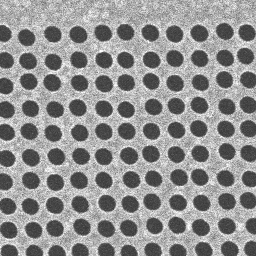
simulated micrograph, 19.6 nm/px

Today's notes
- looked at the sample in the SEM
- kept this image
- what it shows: a regular array of holes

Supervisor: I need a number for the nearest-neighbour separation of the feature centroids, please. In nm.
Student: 443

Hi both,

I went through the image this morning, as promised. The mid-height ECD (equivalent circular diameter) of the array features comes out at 17.7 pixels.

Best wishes